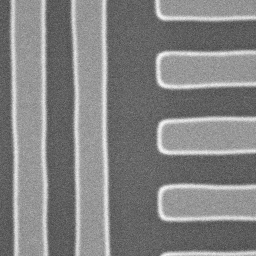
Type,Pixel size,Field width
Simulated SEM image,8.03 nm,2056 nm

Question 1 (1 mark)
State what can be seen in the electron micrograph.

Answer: groups of lines, slits or small figures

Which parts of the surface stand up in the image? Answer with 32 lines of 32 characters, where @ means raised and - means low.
--@@@----@@@@-------@@@@@@@@@@@@
--@@@----@@@@-------@@@@@@@@@@@@
--@@@----@@@@-------------------
--@@@----@@@@-------------------
--@@@----@@@@-------------------
--@@@----@@@@-------------------
--@@@----@@@@-------------------
--@@@----@@@@-------@@@@@@@@@@@@
--@@@----@@@@-------@@@@@@@@@@@@
--@@@-----@@@-------@@@@@@@@@@@@
--@@@-----@@@-------@@@@@@@@@@@@
--@@@-----@@@-------------------
--@@@-----@@@-------------------
--@@@-----@@@-------------------
--@@@@----@@@-------------------
--@@@@----@@@-------@@@@@@@@@@@@
--@@@@----@@@-------@@@@@@@@@@@@
--@@@-----@@@-------@@@@@@@@@@@@
--@@@-----@@@-------@@@@@@@@@@@@
--@@@-----@@@-------------------
--@@@@----@@@-------------------
--@@@@----@@@-------------------
--@@@@----@@@-------------------
--@@@@----@@@-------@@@@@@@@@@@@
--@@@@----@@@-------@@@@@@@@@@@@
--@@@@----@@@-------@@@@@@@@@@@@
--@@@@----@@@-------@@@@@@@@@@@@
--@@@@----@@@-------------------
--@@@@----@@@-------------------
--@@@@----@@@-------------------
--@@@@----@@@-------------------
--@@@@----@@@-------------------